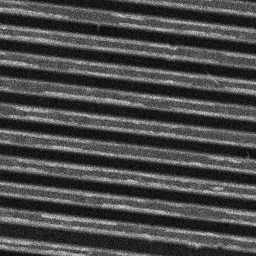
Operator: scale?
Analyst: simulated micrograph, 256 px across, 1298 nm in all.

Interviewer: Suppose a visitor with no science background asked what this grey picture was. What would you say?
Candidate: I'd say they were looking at parallel lines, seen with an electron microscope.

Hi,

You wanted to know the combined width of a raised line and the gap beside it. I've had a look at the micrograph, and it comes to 0.132 microns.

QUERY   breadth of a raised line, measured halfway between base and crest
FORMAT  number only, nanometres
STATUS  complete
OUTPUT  74.9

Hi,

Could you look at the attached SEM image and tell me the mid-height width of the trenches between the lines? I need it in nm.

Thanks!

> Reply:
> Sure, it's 56.7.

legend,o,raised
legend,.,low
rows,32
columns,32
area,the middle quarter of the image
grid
ooooooooooooooooo...............
ooooooooooooooooooooooooo.......
....oooooooooooooooooooooooooooo
............oooooooooooooooooooo
....................oooooooooooo
oooo.........................ooo
oooooooooooo....................
oooooooooooooooooooo............
ooooooooooooooooooooooooooooo...
........oooooooooooooooooooooooo
................oooooooooooooooo
........................oooooooo
oooooooo........................
oooooooooooooooo................
oooooooooooooooooooooooo........
.ooooooooooooooooooooooooooooooo
............oooooooooooooooooooo
..................o.oooooooooooo
ooo.......................oooooo
oooooooooooo....................
oooooooooooooooooooo............
oooooooooooooooooooooooooooo....
.....ooooooooooooooooooooooooooo
..............oooooooooooooooooo
......................oooooooooo
ooooooo.......................oo
ooooooooooooooo.................
oooooooooooooooooooooooo........
...ooooooooooooooooooooooooooooo
...........ooooooooooooooooooooo
...................ooooooooooooo
ooo.........................oooo